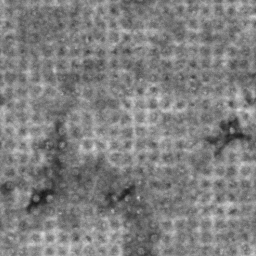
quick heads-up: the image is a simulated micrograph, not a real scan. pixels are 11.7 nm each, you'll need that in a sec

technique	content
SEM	a regular array of raised bodies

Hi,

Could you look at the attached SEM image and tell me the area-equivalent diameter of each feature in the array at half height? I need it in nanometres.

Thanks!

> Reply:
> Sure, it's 73.7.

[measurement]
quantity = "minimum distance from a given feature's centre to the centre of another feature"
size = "145 nm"